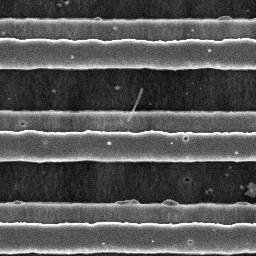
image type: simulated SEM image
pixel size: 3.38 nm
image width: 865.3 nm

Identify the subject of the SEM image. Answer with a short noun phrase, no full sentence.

lines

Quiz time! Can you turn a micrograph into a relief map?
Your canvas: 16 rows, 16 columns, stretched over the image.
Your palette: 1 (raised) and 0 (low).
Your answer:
0000000000000000
1111111111111111
1111111111111111
1111111111111111
0000000000000000
0000000000000000
0000000000000000
1111111111111111
1111111111111111
1111111111111111
0000000000000000
0000000000000000
0000000000000000
1111111111111111
1111111111111111
1111111111111111